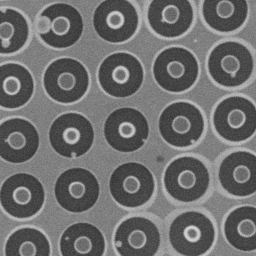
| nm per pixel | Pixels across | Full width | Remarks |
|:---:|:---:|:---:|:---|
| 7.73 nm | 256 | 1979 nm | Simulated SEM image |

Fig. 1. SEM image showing an array of small figures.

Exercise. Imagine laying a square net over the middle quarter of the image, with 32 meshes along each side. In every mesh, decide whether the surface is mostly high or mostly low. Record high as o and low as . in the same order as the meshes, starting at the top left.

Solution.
.....oooo...........oo....oooo..
......ooo....oo.....oo....oooo..
oo....oo....oooo....oo.....ooo..
ooo...oo.....ooo....ooo.........
ooo...ooo...........ooo.........
oo....ooo..........ooooo........
......oooo........ooooooo......o
.....oooooo......ooooooooooooooo
.....ooooooooooooooooooooooooooo
...oooooooooooooooooooooooo.....
oooooooooooooooooooooooooo......
ooooooooooooo.....ooooooo.......
....oooooooo........oooo........
......ooooo.........oooo....ooo.
.......ooo...........ooo...oooo.
.......ooo....ooo....ooo...oooo.
.oo....ooo....ooo....ooo....ooo.
ooo.....oo....ooo....ooo........
ooo.....oo...........oooo.......
.oo....oooo.........ooooo.......
.......ooooo........ooooooo.....
......ooooooo.....oooooooooooooo
.....ooooooooooooooooooooooooooo
oo.ooooooooooooooooooooooooo....
oooooooooooooooo.oooooooooo.....
oooooooooooooo......oooooo......
......ooooooo........oooo.......
.......ooooo..........ooo....ooo
........oooo....oo.....oo....ooo
........ooo....oooo....oo....ooo
..ooo....oo....oooo....oo.....oo
.oooo....oo....ooo.....oo.......